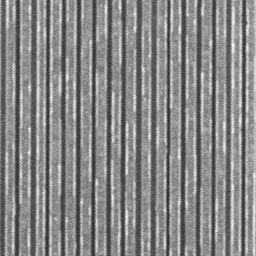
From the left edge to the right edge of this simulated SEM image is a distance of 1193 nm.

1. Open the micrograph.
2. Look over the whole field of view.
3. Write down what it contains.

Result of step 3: parallel lines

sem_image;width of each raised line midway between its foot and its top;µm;0.0437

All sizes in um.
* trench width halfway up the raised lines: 0.0262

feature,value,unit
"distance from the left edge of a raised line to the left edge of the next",70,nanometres